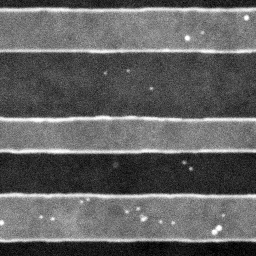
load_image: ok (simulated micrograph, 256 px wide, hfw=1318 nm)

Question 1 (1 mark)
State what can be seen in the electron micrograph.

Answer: lines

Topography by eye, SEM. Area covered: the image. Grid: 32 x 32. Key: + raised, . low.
................................
++++++++++++++++++++++++++++++++
++++++++++++++++++++++++++++++++
++++++++++++++++++++++++++++++++
++++++++++++++++++++++++++++++++
++++++++++++++++++++++++++++++++
............++............++++..
................................
................................
................................
................................
................................
................................
................................
................................
++++++++++++++++++++++++++++++++
++++++++++++++++++++++++++++++++
++++++++++++++++++++++++++++++++
++++++++++++++++++++++++++++++++
................................
................................
................................
................................
................................
+++++++++++++.....+++++++++...++
++++++++++++++++++++++++++++++++
++++++++++++++++++++++++++++++++
++++++++++++++++++++++++++++++++
++++++++++++++++++++++++++++++++
++++++++++++++++++++++++++++++++
................................
................................